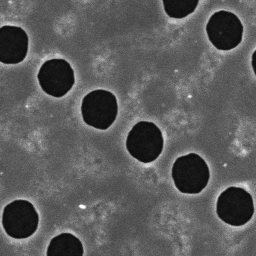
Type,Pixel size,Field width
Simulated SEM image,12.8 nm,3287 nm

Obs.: holes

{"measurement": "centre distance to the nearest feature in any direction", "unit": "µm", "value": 0.711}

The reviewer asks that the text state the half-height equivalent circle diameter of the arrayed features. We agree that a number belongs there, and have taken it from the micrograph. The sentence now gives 38.9 pixels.